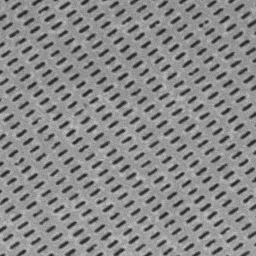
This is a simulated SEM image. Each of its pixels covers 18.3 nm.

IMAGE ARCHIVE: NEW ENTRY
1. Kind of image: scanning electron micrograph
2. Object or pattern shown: a regular array of holes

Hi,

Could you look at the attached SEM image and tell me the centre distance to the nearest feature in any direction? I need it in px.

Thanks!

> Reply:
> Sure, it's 10.1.